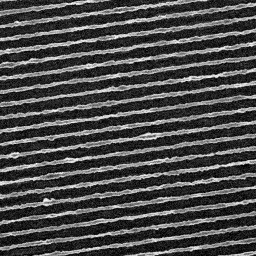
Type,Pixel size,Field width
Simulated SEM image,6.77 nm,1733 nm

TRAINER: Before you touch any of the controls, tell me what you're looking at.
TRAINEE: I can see parallel lines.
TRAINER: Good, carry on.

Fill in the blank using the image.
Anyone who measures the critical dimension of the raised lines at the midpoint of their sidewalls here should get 0.0235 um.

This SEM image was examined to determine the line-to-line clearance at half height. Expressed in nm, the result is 62.1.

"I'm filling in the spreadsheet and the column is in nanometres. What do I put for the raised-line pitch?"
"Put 87.7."